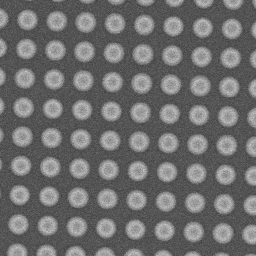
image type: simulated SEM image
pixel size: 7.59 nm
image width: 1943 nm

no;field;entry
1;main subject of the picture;an array of small figures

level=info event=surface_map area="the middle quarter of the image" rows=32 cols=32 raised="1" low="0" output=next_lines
00000000000000000000000000000000
00000000000000000000000000000000
00011110000111000011000000000000
00111110001111000111110001111000
00111110001111100111110011111000
00011110001111000111110011111000
00001100000111000111100001111000
00000000000000000000000000110000
00000000000000000000000000000000
00011100000110000000000000000000
00111110001111000111100001110000
00111110011111000111110011111000
00111110011111000111100011111001
00011100001111000111100011111001
00000000000000000011000001110000
00000000000000000000000000000000
00011000000000000000000000000000
00111100001110000111000001100000
00111110011111001111100011110001
00111110011111001111100011111001
00111100011111001111100011111001
00000000000100000111000011110001
00000000000000000000000000000000
00000000000000000000000000000000
00111100001110000011000000000000
01111100011110001111100011110001
01111100011111001111100111110001
00111100011110001111100111110001
00011000001110000111000011110001
00000000000000000000000000000000
00000000000000000000000000000000
00111000001100000000000000000000